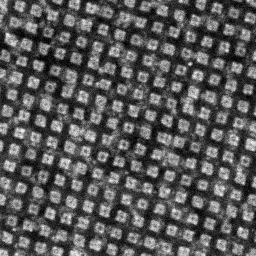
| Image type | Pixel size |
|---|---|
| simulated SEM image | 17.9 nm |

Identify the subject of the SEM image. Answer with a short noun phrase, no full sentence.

holes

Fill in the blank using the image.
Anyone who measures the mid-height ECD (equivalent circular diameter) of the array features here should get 40.5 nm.